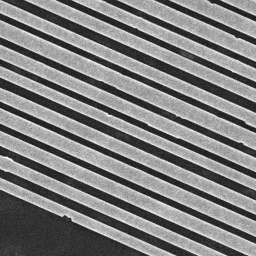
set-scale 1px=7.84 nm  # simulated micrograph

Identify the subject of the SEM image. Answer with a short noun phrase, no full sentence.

parallel lines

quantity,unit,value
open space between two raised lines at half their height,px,6.75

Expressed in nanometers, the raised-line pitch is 159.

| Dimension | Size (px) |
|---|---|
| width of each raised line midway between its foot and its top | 12.3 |